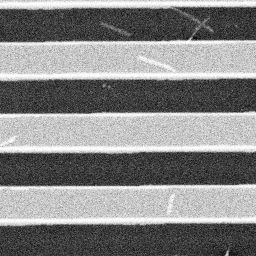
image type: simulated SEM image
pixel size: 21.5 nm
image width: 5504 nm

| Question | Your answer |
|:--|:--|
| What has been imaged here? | lines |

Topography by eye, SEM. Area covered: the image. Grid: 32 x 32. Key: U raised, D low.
UUUUUUUUUUUUUUUUUUUUUUUUUUUUUUUU
DDDDDDDDDDDDDDDDDDDDDDDDDDDDDDDD
DDDDDDDDDDDDDDDDDDDDDDDDDDDDDDDD
DDDDDDDDDDDDDDDDDDDDDDDDDDDDDDDD
DDDDDDDDDDDDDDDDDDDDDDDDDDDDDDDD
UUUUUUUUUUUUUUUUUUUUUUUUUUUUUUUU
UUUUUUUUUUUUUUUUUUUUUUUUUUUUUUUU
UUUUUUUUUUUUUUUUUUUUUUUUUUUUUUUU
UUUUUUUUUUUUUUUUUUUUUUUUUUUUUUUU
UUUUUUUUUUUUUUUUUUUUUUUUUUUUUUUU
DDDDDDDDDDDDDDDDDDDDDDDDDDDDDDDD
DDDDDDDDDDDDDDDDDDDDDDDDDDDDDDDD
DDDDDDDDDDDDDDDDDDDDDDDDDDDDDDDD
DDDDDDDDDDDDDDDDDDDDDDDDDDDDDDDD
UUUUUUUUUUUUUUUUUUUUUUUUUUUUUUUU
UUUUUUUUUUUUUUUUUUUUUUUUUUUUUUUU
UUUUUUUUUUUUUUUUUUUUUUUUUUUUUUUU
UUUUUUUUUUUUUUUUUUUUUUUUUUUUUUUU
UUUUUUUUUUUUUUUUUUUUUUUUUUUUUUUU
DDDDDDDDDDDDDDDDDDDDDDDDDDDDDDDD
DDDDDDDDDDDDDDDDDDDDDDDDDDDDDDDD
DDDDDDDDDDDDDDDDDDDDDDDDDDDDDDDD
DDDDDDDDDDDDDDDDDDDDDDDDDDDDDDDD
UUUUUUUUUUUUUUUUUUUUUUUUUUUUUUUU
UUUUUUUUUUUUUUUUUUUUUUUUUUUUUUUU
UUUUUUUUUUUUUUUUUUUUUUUUUUUUUUUU
UUUUUUUUUUUUUUUUUUUUUUUUUUUUUUUU
UUUUUUUUUUUUUUUUUUUUUUUUUUUUUUUU
DDDDDDDDDDDDDDDDDDDDDDDDDDDDDDDD
DDDDDDDDDDDDDDDDDDDDDDDDDDDDDDDD
DDDDDDDDDDDDDDDDDDDDDDDDDDDDDDDD
DDDDDDDDDDDDDDDDDDDDDDDDDDDDDDDD